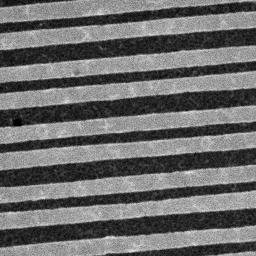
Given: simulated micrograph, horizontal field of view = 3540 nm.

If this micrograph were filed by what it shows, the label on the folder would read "parallel lines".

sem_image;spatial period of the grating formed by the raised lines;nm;417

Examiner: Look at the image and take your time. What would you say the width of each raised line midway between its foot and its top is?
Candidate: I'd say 208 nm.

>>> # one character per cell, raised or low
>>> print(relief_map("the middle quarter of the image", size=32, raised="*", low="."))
********************************
**********************..........
*******.*...................*...
................................
.....................***********
.......*************************
*****************.**************
************************........
***************.................
.**.............................
......................*.........
................................
...................*.....*******
.............*******************
....****************************
**********.********************.
********************............
********........................
................................
.....................***********
.......*************************
***********.********************
***************************.....
**************..................
*.*.............................
................................
................................
.........................******.
.............*******************
...*****************************
******************************..
*********************...........